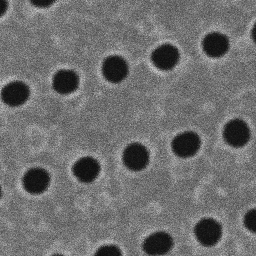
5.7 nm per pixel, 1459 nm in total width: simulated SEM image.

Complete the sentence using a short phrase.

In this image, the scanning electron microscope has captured a regular array of holes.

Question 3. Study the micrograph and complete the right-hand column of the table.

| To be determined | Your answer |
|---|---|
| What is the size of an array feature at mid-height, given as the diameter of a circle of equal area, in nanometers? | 160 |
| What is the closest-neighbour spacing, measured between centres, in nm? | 292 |